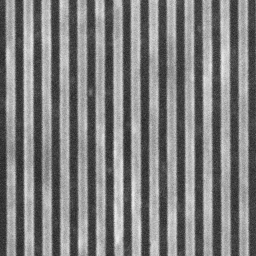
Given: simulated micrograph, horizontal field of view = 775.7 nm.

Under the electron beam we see parallel lines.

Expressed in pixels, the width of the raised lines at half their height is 7.76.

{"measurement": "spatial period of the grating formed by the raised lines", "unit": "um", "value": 0.0542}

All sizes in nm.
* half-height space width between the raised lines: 29.2